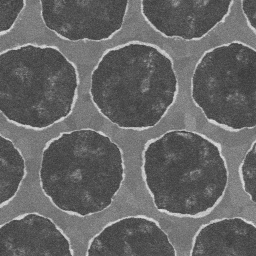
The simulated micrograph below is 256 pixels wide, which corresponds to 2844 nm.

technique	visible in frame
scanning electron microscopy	holes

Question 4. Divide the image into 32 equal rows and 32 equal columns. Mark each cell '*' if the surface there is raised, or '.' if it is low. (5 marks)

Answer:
...**...........**...........*..
..***...........**...........*..
..***..........***..........***.
.*****.........****.......******
********......*******....*******
****************..**********..**
*......******.......******......
........*****........****.......
.........***..........***.......
..........**..........**........
..........*...........**........
.........**...........**........
.........***..........**........
.........***.........****.......
*.......*****.......******......
**.....*******.....********.....
*********...*********...********
.******.......******......******
..****.........***.........****.
...**..........***..........***.
...**..........***..........**..
...**..........***..........**..
...**..........***..........**..
..***..........****.........***.
..****........*****.........***.
*******.......*****........*****
*********...*********.....******
**....*********....*********..**
.......******.......*****.......
........****.........***........
.........**..........***........
.........**...........**........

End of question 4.